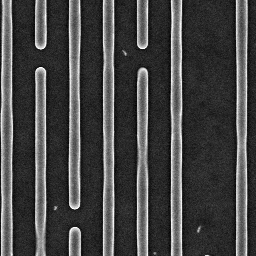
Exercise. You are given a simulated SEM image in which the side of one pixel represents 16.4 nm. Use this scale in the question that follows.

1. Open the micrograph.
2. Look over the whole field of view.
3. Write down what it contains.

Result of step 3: groups of lines, slits or small figures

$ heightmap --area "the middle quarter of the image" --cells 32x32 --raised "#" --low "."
..##......##...............##...
..##......##.......##......##...
..##......##.......##......##...
..##......##......###......##...
..##......##......###......##...
..##......##......###......##...
..##......##......###......##...
..##......##......###......##...
..##......##......###......##...
..##......##......###......##...
..##......##......###......##...
..##......##......###......##...
..##......##......###......##...
..##......##......###......##...
..##......##......###......##...
..##......##......###......##...
..##......##......###......##...
..##......##......###......##...
..##......##......###......##...
..##......##......###......##...
..##......##.......##......##...
.###......##.......##......##...
.###......##.......##......##...
.###......##.......##......##...
.###......##.......##......##...
.###......##......###......##...
.###......##......###......##...
.###......##......###......##...
.###......##......###......##...
.###......##......###......##...
.###......##......###......##...
.###......##......###......##...